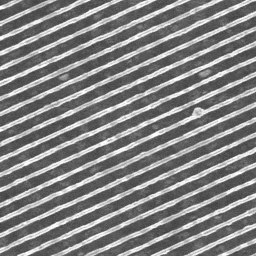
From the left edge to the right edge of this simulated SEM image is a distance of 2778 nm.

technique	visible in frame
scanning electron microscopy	parallel lines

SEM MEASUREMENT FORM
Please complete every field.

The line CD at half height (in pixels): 3.53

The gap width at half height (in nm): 114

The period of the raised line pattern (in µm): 0.15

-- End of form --